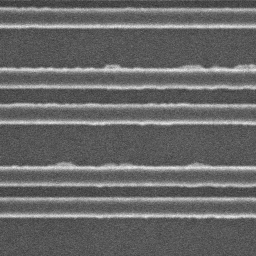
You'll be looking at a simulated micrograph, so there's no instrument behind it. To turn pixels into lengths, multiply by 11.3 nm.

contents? lines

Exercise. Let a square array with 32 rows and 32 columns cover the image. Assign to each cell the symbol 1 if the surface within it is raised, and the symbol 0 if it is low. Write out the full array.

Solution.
00000000000000000000000000000000
11111111111111111111111111111111
11111111111111111111111111111111
00000000000000000000000000000000
00000000000000000000000000000000
00000000000000000000000000000000
00000000000000000000000000000000
00000000000000000000000000000000
00000000000000000000000000000000
11111111111111111111111111111111
11111111111111111111111111111111
00000000000000000000000000000000
00000000000000000000000000000000
11111111111111111111111111111111
11111111111111111111111111111111
00000000000100000000010000000000
00000000000000000000000000000000
00000000000000000000000000000000
00000000000000000000000000000000
00000000000000000000000000000000
00000000000000000000000000000000
11111111111111111111111111111111
11111111111111111111111111111111
00000000000000000000000000000000
00000000000000000000000000000000
11111111111111111111111111111111
11111111111111111111111111111111
00000000000000000000000000000000
00000000000000000000000000000000
00000000000000000000000000000000
00000000000000000000000000000000
00000000000000000000000000000000